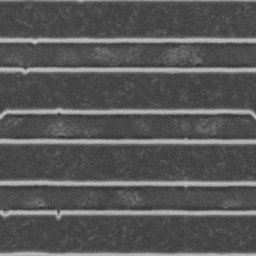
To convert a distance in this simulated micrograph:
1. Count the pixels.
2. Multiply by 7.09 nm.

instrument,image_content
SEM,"one or a few lines or trenches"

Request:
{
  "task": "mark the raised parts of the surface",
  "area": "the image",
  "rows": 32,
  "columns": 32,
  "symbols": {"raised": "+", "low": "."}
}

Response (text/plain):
++++++++++++++++++++++++++++++++
++++++++++++++++++++++++++++++++
++++++++++++++++++++++++++++++++
++++++++++++++++++++++++++++++++
++++++++++++++++++++++++++++++++
................................
................................
................................
................................
++++++++++++++++++++++++++++++++
++++++++++++++++++++++++++++++++
++++++++++++++++++++++++++++++++
++++++++++++++++++++++++++++++++
++++++++++++++++++++++++++++++++
................................
................................
................................
................................
++++++++++++++++++++++++++++++++
++++++++++++++++++++++++++++++++
++++++++++++++++++++++++++++++++
++++++++++++++++++++++++++++++++
++++++++++++++++++++++++++++++++
................................
................................
................................
................................
++++++++++++++++++++++++++++++++
++++++++++++++++++++++++++++++++
++++++++++++++++++++++++++++++++
++++++++++++++++++++++++++++++++
++++++++++++++++++++++++++++++++